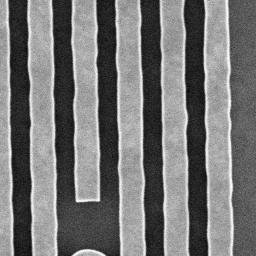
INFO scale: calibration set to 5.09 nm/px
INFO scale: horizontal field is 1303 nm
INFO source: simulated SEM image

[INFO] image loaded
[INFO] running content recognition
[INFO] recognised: groups of lines, slits or small figures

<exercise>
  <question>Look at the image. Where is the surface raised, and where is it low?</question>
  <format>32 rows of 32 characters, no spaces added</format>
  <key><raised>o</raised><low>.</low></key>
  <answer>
o...oo...ooo...oo...ooo...oo....
o...oo...ooo...ooo..ooo...oo....
o...oo...ooo...ooo..ooo...oo....
o...oo...ooo...oo...ooo...oo....
o...ooo..ooo...oo...ooo...ooo...
o...ooo..ooo...oo...ooo...ooo...
o...ooo..ooo...ooo..ooo...ooo...
o...ooo..ooo...ooo..ooo...ooo...
o...ooo..ooo...ooo..ooo...ooo...
o...ooo..ooo...ooo..ooo...ooo...
o...ooo..ooo...ooo..ooo...ooo...
o...ooo..ooo...ooo..ooo...ooo...
o...ooo..ooo...ooo..ooo...ooo...
o...ooo..ooo...ooo..ooo...ooo...
o...ooo..ooo...ooo..ooo...ooo...
o...ooo..ooo...ooo..ooo...ooo...
o...ooo..ooo...ooo..ooo...ooo...
o...ooo..ooo...ooo..ooo...ooo...
o...ooo..ooo...ooo..ooo...ooo...
o...ooo..ooo...ooo..ooo...ooo...
o...ooo..ooo...ooo...oo...ooo...
o...ooo..ooo...ooo..ooo...ooo...
o...ooo..ooo...ooo...oo...ooo...
o...ooo...oo...ooo...oo...ooo...
o...ooo...oo...ooo...oo...ooo...
o...ooo........ooo...oo...ooo...
oo..ooo........ooo...oo...ooo...
oo..ooo........ooo...ooo..ooo...
oo..ooo........ooo...ooo..ooo...
oo..ooo........ooo...oo...ooo...
oo..ooo........ooo...oo...ooo...
oo..ooo...oo...ooo...ooo..ooo...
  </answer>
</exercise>